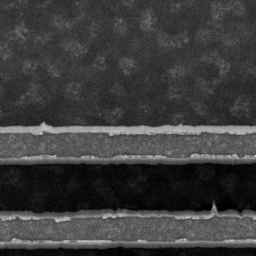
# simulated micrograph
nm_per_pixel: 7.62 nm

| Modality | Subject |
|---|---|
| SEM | one or a few lines or trenches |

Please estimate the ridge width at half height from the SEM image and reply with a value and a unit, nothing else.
0.236 µm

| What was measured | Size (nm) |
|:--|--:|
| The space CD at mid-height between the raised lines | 402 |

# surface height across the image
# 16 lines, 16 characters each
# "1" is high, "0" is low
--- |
0000000000000000
0000000000000000
0000000000000000
0000000000000000
0000000000000000
0000000000000000
0000000000000000
0000000000000000
1111111111111111
1111111111111111
0000000000000000
0000000000000000
0000000000000000
1111111111111111
1111111111111111
0000000000000000